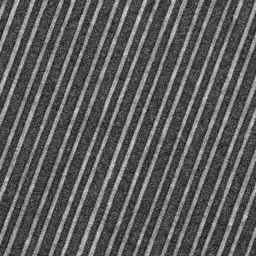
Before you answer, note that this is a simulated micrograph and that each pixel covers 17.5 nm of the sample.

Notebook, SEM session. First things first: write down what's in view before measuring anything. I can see parallel lines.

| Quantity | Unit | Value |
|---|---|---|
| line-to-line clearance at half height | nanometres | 169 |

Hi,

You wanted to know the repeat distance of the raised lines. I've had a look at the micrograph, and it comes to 0.229 micrometres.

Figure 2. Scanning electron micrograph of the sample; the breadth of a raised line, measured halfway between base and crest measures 55.3 nanometers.